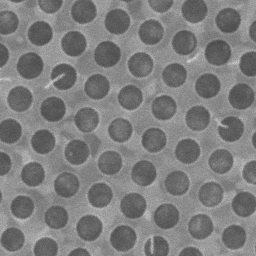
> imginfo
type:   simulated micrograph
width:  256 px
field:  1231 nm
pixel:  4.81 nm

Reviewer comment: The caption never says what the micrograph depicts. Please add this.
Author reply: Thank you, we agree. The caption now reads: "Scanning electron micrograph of a regular array of holes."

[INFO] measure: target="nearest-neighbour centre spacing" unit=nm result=164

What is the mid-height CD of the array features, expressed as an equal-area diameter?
127 nanometers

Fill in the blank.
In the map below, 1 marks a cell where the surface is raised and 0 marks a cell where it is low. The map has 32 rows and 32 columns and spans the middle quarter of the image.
00111111100001110000000110000011
00011111111111110000001110000001
00011111011111111000001100000001
00011100000111111110111100000001
00011000000111111111111110000011
00111000000011100011111111000111
01111000000111000001111111111111
11111000000110000000111111111111
11111100001110000000111000011111
11111111111111000000110000001111
01111111111111000001110000001111
01110000111111100011110000001110
11100000011111111111110000001100
11000000011110011111111000011100
11000000011100000111111111111100
11100000011000000111111111111110
11110000111000000111000001111111
11111111111000000111000000111111
11111111111000000110000000111100
10000111111110011110000000111000
00000011111111111110000001110000
00000011111011111111000001110000
00000011100000111111111111110000
00000011000000011111111111110000
10000111000000011100001111111000
11111111000000011000000111111111
11111111100000111000000111110111
00011111110001111000000111000001
00011111111111111000000110000001
00001111101111111000000110000000
00001110000011111110011110000001
00001100000011111111111110000001